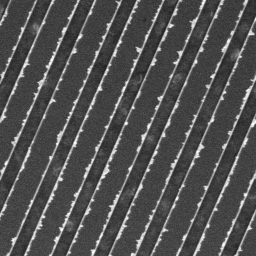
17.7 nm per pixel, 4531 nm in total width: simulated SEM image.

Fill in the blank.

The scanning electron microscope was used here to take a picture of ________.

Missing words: parallel lines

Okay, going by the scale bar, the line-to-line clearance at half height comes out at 14.5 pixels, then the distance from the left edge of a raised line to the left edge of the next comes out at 0.684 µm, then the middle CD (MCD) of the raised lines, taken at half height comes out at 429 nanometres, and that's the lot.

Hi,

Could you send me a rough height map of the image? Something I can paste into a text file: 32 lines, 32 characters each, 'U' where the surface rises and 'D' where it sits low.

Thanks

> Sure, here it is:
DUUUDDUUUUDDUUUDDUUUDDUUUDDUUUUD
DUUUDDUUUDDUUUUDDUUUDDUUUDDUUUDD
UUUDDUUUUDDUUUDDUUUDDUUUUDDUUUDD
UUUDDUUUDDUUUUDDUUUDDUUUDDUUUDDU
UUUDDUUUDDUUUDDUUUDDUUUUDDUUUDDU
UUDDUUUDDUUUUDDUUUDDUUUDDUUUUDDU
UUDDUUUDDUUUDDUUUUDDUUUDDUUUDDUU
UDDUUUUDDUUUDDUUUDDUUUDDUUUUDDUU
UDDUUUDDUUUDDUUUUDDUUUDDUUUDDUUU
DDUUUUDDUUUDDUUUDDUUUDDUUUUDDUUU
DDUUUDDUUUUDDUUUDDUUUDDUUUDDUUUU
DDUUUDDUUUDDUUUDDUUUUDDUUUDDUUUD
DUUUDDUUUUDDUUUDDUUUDDUUUDDUUUUD
DUUUDDUUUDDUUUUDUUUUDDUUUDDUUUDD
UUUDDUUUUDDUUUDDUUUDDUUUUDDUUUDD
UUUDDUUUDDUUUUDDUUUDDUUUDDUUUUDU
UUUDDUUUDDUUUDDUUUDDUUUUDDUUUDDU
UUDDUUUDDUUUUDDUUUDDUUUDDUUUUDDU
UUDDUUUDDUUUDDUUUDDUUUUDDUUUDDUU
UDDUUUUDDUUUDDUUUDDUUUDDUUUUDDUU
UDDUUUDDUUUDDUUUUDDUUUDDUUUDDUUU
DDUUUUDDUUUDDUUUDDUUUDDUUUUDDUUU
DDUUUDDUUUUDDUUUDDUUUDDUUUDDUUUU
DDUUUDDUUUDDUUUDDUUUUDDUUUDDUUUD
DUUUDDUUUUDDUUUDDUUUDDUUUUDUUUUD
DUUUDDUUUDDUUUDDUUUUDDUUUDDUUUDD
UUUDDUUUUDDUUUDDUUUDDUUUUDDUUUDD
UUUDDUUUDDUUUUDDUUUDDUUUDDUUUDDU
UUUDDUUUDDUUUDDUUUDDUUUUDDUUUDDU
UUDDUUUDDUUUUDDUUUDDUUUDDUUUUDDU
UUDDUUUDDUUUDDUUUDDUUUUDDUUUDDUU
UDDUUUUDDUUUDDUUUDDUUUDDUUUUDDUU